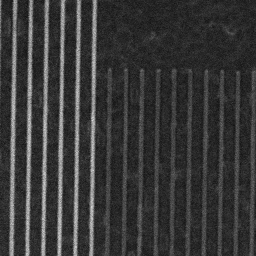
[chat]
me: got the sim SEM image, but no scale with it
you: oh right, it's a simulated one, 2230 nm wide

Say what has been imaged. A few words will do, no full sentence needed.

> parallel lines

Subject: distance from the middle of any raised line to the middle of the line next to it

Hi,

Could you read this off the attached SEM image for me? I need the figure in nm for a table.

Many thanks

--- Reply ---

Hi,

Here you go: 139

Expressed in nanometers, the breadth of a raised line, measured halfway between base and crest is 23.9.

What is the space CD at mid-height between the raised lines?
110 nm